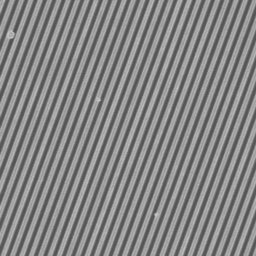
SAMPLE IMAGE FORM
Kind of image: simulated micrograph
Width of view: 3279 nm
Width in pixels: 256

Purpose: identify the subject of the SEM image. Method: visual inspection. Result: parallel lines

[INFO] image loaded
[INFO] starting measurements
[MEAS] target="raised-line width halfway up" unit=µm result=0.0602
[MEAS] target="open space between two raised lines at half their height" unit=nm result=48.2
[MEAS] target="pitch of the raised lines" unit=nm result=112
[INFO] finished